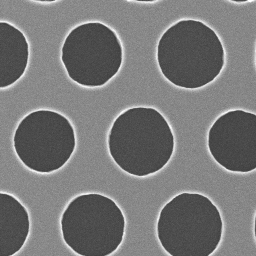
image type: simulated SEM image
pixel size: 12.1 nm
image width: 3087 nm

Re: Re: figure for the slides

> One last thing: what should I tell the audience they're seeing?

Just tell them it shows holes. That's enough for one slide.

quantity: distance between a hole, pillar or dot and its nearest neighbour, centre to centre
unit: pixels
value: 97.5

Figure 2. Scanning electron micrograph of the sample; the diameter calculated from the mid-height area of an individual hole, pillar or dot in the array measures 0.772 um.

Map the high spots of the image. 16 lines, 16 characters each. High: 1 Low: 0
1111111111111111
1111101111100111
0011000111000011
0011000011000011
0111000111000011
1111111111111111
1111111111111111
1000111000111100
1000011000011000
1000011000011000
1100111100111100
1111111111111111
0111100111100111
0011000011000011
0011000011000011
0111000111000111